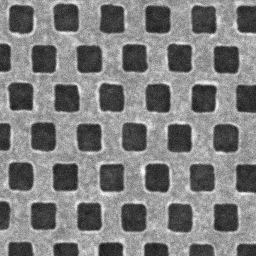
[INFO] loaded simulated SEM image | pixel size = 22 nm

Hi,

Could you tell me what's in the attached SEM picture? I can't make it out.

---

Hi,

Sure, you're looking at a regular array of holes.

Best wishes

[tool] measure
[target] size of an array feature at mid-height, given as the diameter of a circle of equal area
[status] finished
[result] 666 nanometers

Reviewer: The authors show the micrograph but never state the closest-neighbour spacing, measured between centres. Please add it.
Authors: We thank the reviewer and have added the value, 987 nm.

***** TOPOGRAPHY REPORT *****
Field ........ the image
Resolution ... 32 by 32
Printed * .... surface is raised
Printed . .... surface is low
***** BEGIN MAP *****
*******..****.******************
*...***...**....**...***...**...
*...***...**....**...***...***..
*...***...**....**...***...***..
********************************
.***************..***..*********
.***...***...**...***...***...**
.***...***...**...***...***...**
.***...***...**...***...***...**
********************************
*...*********..****..****.******
*...***...**....**...***...**...
*...***...**....**...***...**...
*...***...**...***...***...***..
********************************
.***...***..***...***..****..***
.***...**....**...***...***...**
.***...***...**...***...***...**
.***...***...**...***...***...**
********************************
*...***..****..****.****..****..
*...***...**....**...***...**...
*...**....**....**...***...**...
*...***...***...**...***...**...
********************************
.***...***..****..***...***..***
.***...***...**...***...***...**
.***...***...**...***...***...**
.***...***...**...***...***...**
********************************
*...***...***..***...***..****..
*...***...**...***...***...***..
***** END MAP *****